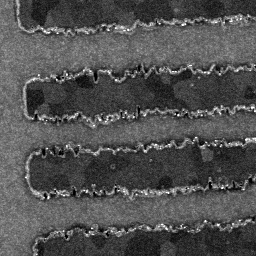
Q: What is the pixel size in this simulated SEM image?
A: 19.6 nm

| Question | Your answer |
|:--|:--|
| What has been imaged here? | one or a few lines or trenches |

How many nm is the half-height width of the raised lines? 829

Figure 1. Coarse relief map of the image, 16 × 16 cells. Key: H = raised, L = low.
LHHHHHHHHHHHHHHH
LHHHHHHHHHLLLLLL
LLLLLLLLLLLLLLLL
LLLLLLLLLLLLLLLL
LLLLLLLLHHHHHHHH
LLHHHHHHHHHHHHHH
LLHHHHHHHHHHHHHH
LLLLLLLLLLLLLLLL
LLLLLLLLLLLLLLLL
LLLHHHHHHHHHHHHH
LLHHHHHHHHHHHHHH
LLHHHHHHHHHHHHHL
LLLLLLLLLLLLLLLL
LLLLLLLLLLLLLLLL
LLLLHHHHHHHHHHHH
LLHHHHHHHHHHHHHH